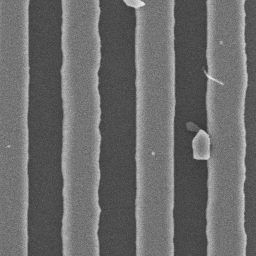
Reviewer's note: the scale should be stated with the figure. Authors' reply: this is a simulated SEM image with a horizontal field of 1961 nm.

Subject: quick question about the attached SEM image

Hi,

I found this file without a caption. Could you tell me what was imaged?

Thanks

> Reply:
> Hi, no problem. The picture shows lines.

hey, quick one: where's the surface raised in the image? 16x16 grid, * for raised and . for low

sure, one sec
**..**..***..**.
**..**..***..**.
**..**..***..**.
**..**..***..**.
**..**...**..**.
**..**..***..**.
**..**...**..**.
**..**...**..**.
**..**...**.***.
**..**..***.***.
**..**...**..**.
**..**...**..**.
**..**...**..**.
**..**..***..**.
**..**...**..**.
**..**...**..**.